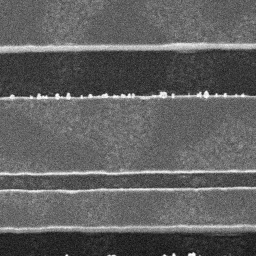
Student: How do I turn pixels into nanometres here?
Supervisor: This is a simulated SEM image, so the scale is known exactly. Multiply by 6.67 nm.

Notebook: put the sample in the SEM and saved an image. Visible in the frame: lines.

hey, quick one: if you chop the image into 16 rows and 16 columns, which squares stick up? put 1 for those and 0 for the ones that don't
1111111111111111
1111111111111111
1111111111111111
0000000000000000
0000000000000000
0000000000000000
1111111111111111
1111111111111111
1111111111111111
1111111111111111
1111111111111111
1111111111111111
1111111111111111
1111111111111111
0000000000000000
0000000000000000